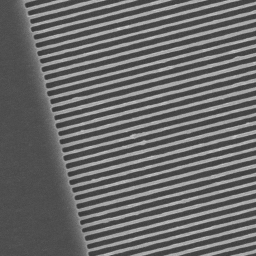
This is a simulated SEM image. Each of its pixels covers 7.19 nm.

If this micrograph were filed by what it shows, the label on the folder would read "parallel lines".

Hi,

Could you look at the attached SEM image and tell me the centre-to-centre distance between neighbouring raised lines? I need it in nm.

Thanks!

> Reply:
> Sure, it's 59.7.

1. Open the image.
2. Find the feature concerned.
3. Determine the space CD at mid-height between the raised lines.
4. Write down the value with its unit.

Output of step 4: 36.6 nm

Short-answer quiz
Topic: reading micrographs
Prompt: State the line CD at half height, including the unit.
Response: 24.5 nm